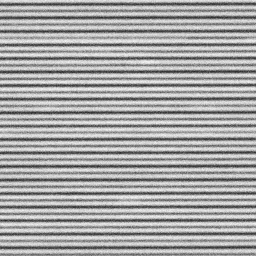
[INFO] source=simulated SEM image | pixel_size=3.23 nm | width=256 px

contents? parallel lines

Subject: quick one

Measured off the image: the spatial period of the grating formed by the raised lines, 21.8 nm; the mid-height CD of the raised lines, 12.9 nanometers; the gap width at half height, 9.3 nm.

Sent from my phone